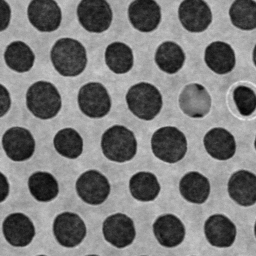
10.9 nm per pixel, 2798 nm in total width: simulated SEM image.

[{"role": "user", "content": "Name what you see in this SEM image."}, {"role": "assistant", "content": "a regular array of holes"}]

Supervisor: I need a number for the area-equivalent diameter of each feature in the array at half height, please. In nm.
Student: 366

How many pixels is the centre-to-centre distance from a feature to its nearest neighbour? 49.7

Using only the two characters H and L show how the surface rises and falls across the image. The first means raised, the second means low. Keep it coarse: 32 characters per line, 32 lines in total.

LHHHLLLHHHLLLLHHLLLLHHHLLLHHHLLL
LHHLLLLLHHLLLLHHLLLLHHLLLLHHHLLL
LHHHLLLLHHLLLLHHLLLLHHLLLLHHHLLL
LHHHLLLHHHLLLLHHHLLLHHHLLLHHHHLL
HHHHHHHHHHHHHHHHHHHHHHHHHHHHHHHH
HLLHHHHLLLHHHHLLHHHHLLHHHHLLHHHH
HLLLHHLLLLLHHLLLLHHLLLLHHHLLLHHH
HLLLHHLLLLLHHLLLLHHLLLLHHHLLLHHH
HLLLHHHLLLLHHHLLHHHHLLLHHHLLLHHH
HHHHHHHHLHHHHHHHHHHHHHHHHHHHHHHH
HHHHLLLHHHHLLHHHHLLHHHHHLHHHHHHH
LHHLLLLHHHLLLHHHLLLLHHHLLLHHHLLL
LHHLLLLLHHLLLLHHLLLLHHLLLLHHHLLL
LHHLLLLLHHLLLLHHLLLLHHHLLLHHHHLL
HHHHLLLHHHHLLHHHHLLLHHHLLLHHHHHH
HHHHHHHHHHHHHHHHHHHHHHHHHHHHHHHH
HLLLHHHLLLHHHLLLLHHLLLLHHHLLLHHH
LLLLHHHLLLHHHLLLLHHLLLLHHLLLLHHH
LLLLHHHLLLHHHLLLLHHLLLLHHHLLLHHH
HLLLHHHHLLHHHLLLLHHLLLLHHHLLLHHH
HHHHHHHHHHHHHHHHHHHHHHHHHHHHHHHH
HHHHLLHHHHHLHHHHHLLHHHHHHHHHHLLH
LHHHLLLHHHLLLHHHLLLLHHHLLLHHHLLL
LHHHLLLHHLLLLLHHLLLLHHLLLLHHLLLL
LHHHLLLHHHLLLLHHHLLLHHHLLLHHHLLL
HHHHHHHHHHHLLHHHHHHHHHHHLHHHHHLL
HHHHHHHHLHHHHHHHHHHHHHHHHHHHHHHH
LLLLHHHLLLHHHLLLHHHLLLLHHHLLLHHH
LLLLHHHLLLLHHLLLLHHLLLLHHLLLLLHH
LLLLHHHLLLLHHLLLLHHLLLLHHHLLLLHH
HLLLHHHLLLHHHHLLHHHHLLHHHHLLLHHH
HHHHHHHHHHHHHHHHHHHHHHHHHHHHHHHH